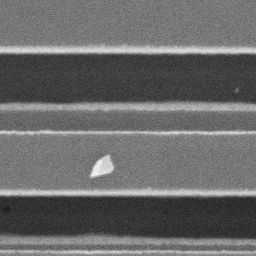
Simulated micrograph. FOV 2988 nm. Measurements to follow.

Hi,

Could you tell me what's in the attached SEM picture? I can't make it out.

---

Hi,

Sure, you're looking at lines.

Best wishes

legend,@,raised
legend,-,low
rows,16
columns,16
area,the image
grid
@@@@@@@@@@@@@@@@
@@@@@@@@@@@@@@@@
@@@@@@@@@@@@@@@@
----------------
----------------
----------------
----------------
@@@@@@@@@@@@@@@@
@@@@@@@@@@@@@@@@
@@@@@@@@@@@@@@@@
@@@@@@@@@@@@@@@@
@@@@@@@@@@@@@@@@
----------------
----------------
----------------
@@@@@@@@@@@@@@@@